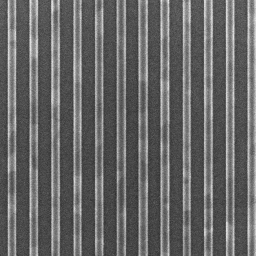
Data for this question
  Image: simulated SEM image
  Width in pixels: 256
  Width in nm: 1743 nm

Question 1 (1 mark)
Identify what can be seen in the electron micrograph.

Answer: parallel lines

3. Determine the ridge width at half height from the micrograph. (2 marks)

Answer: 54.5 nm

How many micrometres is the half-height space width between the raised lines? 0.0945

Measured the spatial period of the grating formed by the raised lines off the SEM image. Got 149 nanometers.